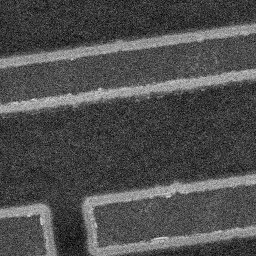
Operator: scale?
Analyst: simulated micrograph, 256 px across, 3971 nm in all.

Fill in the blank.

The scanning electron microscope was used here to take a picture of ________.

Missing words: one or a few lines or trenches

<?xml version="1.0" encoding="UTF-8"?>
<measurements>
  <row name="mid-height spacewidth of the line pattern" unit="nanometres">1600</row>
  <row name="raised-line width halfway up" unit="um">0.72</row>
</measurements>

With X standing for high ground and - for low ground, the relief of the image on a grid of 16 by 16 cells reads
----------------
----------------
-----------XXXXX
---XXXXXXXXXXXXX
XXXXXXXXXXXXXXXX
XXXXXXXXXX------
XXX-------------
----------------
----------------
----------------
----------------
--------------XX
------XXXXXXXXXX
XXX---XXXXXXXXXX
XXX---XXXXXXXXXX
XXX---XX--------